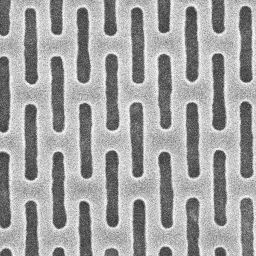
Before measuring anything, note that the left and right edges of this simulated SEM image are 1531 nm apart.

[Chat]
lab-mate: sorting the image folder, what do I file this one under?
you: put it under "a regular array of holes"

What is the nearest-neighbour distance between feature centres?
320 nanometers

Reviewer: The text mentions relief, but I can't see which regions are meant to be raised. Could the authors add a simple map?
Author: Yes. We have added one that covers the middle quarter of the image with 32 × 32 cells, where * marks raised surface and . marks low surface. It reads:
***....***....***...***....***..
***....***....***...***....***..
***....***....***...***....***..
***...****....***...***....***..
****..****....****..***....****.
**********....**********...*****
**********....**********...*****
**********....**********...*****
**********....*********....*****
**********....*********....*****
****...***....**....****...***..
****...***....**....****...***..
****...***....**....****...***..
****...***....**....****...***..
****...***....**....****...***..
****...***....**....****...***..
****...****..***....*****.****..
****...*********....**********..
****...**********...**********..
****...**********...**********..
****...**********...***********.
****...**********...***********.
****...***...****...****..*****.
****...***....***...***....****.
****...***....***...***....****.
****...***....***...****...****.
****...***....***...****...****.
****...***....***...****...****.
*****.****....****.*****...*****
**********....**********...*****
**********....**********...*****
**********....**********...*****